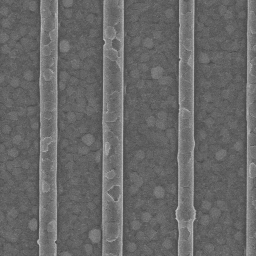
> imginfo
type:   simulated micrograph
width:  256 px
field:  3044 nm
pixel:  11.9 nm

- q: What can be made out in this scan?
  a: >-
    one or a few lines or trenches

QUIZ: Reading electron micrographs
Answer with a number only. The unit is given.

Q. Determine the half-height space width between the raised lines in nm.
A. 636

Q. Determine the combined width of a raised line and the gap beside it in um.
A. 0.817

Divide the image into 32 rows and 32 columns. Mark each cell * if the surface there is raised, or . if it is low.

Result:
.....**......**.......**.......*
.....**......**.......**.......*
.....**......**.......**.......*
.....**......**.......**.......*
.....**......**.......**.......*
.....**......**.......**.......*
.....**......**.......**.......*
.....**......**.......**.......*
.....**......**.......**.......*
.....**......**.......**.......*
.....**......**.......**.......*
.....**......**.......**.......*
.....**......**.......**.......*
.....**......**.......**.......*
.....**......**.......**.......*
.....**......**.......**.......*
.....**......**.......**.......*
.....**......**.......**.......*
.....**......**.......**.......*
.....**......**.......**.......*
.....**......**.......**.......*
.....**......**.......**.......*
.....**......**.......**.......*
.....**......**.......**.......*
.....**......**.......**.......*
.....**......**.......**.......*
.....**......**.......**.......*
.....**......**.......**.......*
.....**......**.......**.......*
.....**.....***.......**.......*
.....**......**.......**.......*
.....**......**.......**.......*